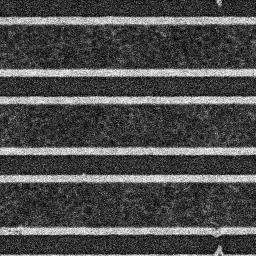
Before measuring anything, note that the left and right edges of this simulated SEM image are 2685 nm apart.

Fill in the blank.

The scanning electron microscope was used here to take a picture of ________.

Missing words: one or a few lines or trenches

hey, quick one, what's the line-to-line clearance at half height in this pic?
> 0.29 microns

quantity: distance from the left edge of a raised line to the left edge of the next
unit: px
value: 79.2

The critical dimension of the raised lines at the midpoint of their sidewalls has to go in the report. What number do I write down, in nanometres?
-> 540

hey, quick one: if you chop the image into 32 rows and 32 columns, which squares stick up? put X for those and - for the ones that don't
--------------------------------
--------------------------------
--------------------------------
XXXXXXXXXXXXXXXXXXXXXXXXXXXXXXXX
XXXXXXXXXXXXXXXXXXXXXXXXXXXXXXXX
XXXXXXXXXXXXXXXXXXXXXXXXXXXXXXXX
XXXXXXXXXXXXXXXXXXXXXXXXXXXXXXXX
XXXXXXXXXXXXXXXXXXXXXXXXXXXXXXXX
XXXXXXXXXXXXXXXXXXXXXXXXXXXXXXXX
--------------------------------
--------------------------------
--------------------------------
--------------------------------
XXXXXXXXXXXXXXXXXXXXXXXXXXXXXXXX
XXXXXXXXXXXXXXXXXXXXXXXXXXXXXXXX
XXXXXXXXXXXXXXXXXXXXXXXXXXXXXXXX
XXXXXXXXXXXXXXXXXXXXXXXXXXXXXXXX
XXXXXXXXXXXXXXXXXXXXXXXXXXXXXXXX
XXXXXXXXXXXXXXXXXXXXXXXXXXXXXXXX
--------------------------------
--------------------------------
--------------------------------
XXXXXXXXXXXXXXXXXXXXXXXXXXXXXXXX
XXXXXXXXXXXXXXXXXXXXXXXXXXXXXXXX
XXXXXXXXXXXXXXXXXXXXXXXXXXXXXXXX
XXXXXXXXXXXXXXXXXXXXXXXXXXXXXXXX
XXXXXXXXXXXXXXXXXXXXXXXXXXXXXXXX
XXXXXXXXXXXXXXXXXXXXXXXXXXXXXXXX
XXXXXXXXXXXXXXXXXXXXXXXXXXXXXXXX
--------------------------------
--------------------------------
--------------------------------